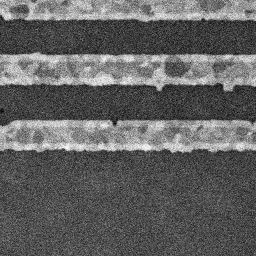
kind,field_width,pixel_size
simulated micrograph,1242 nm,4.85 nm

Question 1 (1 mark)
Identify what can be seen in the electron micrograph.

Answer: one or a few lines or trenches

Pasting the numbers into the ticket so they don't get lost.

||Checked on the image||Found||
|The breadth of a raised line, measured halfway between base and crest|0.121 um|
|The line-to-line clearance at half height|195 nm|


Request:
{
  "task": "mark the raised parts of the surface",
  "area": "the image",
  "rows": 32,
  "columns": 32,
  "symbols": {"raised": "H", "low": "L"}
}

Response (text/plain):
HHHHHHHHHHHHHHHHHHHHHHHHHHHHHHHH
HHHHHHHHHHHHHHHHHHHHHHHHHHHHHHHH
LLLLLLLLLLLLLLLLLLLLLLLLLLLLLLLL
LLLLLLLLLLLLLLLLLLLLLLLLLLLLLLLL
LLLLLLLLLLLLLLLLLLLLLLLLLLLLLLLL
LLLLLLLLLLLLLLLLLLLLLLLLLLLLLLLL
LLLLLLLLLLLLLLLLLLLLLLLLLLLLLLLL
HHHHHHHHHHHHHHHHHHHHHHHHHHHHHHHH
HHHHHHHHHHHHHHHHHHHHHHHHHHHHHHHH
HHHHHHHHHHHHHHHHHHHHHHHHHHHHHHHH
LLLLLLLLLLLLLLLLLLLHLLLLLLLLHLLL
LLLLLLLLLLLLLLLLLLLLLLLLLLLLLLLL
LLLLLLLLLLLLLLLLLLLLLLLLLLLLLLLL
LLLLLLLLLLLLLLLLLLLLLLLLLLLLLLLL
LLLLLLLLLLLLLLLLLLLLLLLLLLLLLLLL
LLHHHHHHHHHHHHLHHHHHHHHHHHHHHHHL
HHHHHHHHHHHHHHHHHHHHHHHHHHHHHHHH
HHHHHHHHHHHHHHHHHHHHHHHHHHHHHHHH
LLLLLHHLHLHHHLLHHLHHLHHHLLLHHHLH
LLLLLLLLLLLLLLLLLLLLLLLLLLLLLLLL
LLLLLLLLLLLLLLLLLLLLLLLLLLLLLLLL
LLLLLLLLLLLLLLLLLLLLLLLLLLLLLLLL
LLLLLLLLLLLLLLLLLLLLLLLLLLLLLLLL
LLLLLLLLLLLLLLLLLLLLLLLLLLLLLLLL
LLLLLLLLLLLLLLLLLLLLLLLLLLLLLLLL
LLLLLLLLLLLLLLLLLLLLLLLLLLLLLLLL
LLLLLLLLLLLLLLLLLLLLLLLLLLLLLLLL
LLLLLLLLLLLLLLLLLLLLLLLLLLLLLLLL
LLLLLLLLLLLLLLLLLLLLLLLLLLLLLLLL
LLLLLLLLLLLLLLLLLLLLLLLLLLLLLLLL
LLLLLLLLLLLLLLLLLLLLLLLLLLLLLLLL
LLLLLLLLLLLLLLLLLLLLLLLLLLLLLLLL